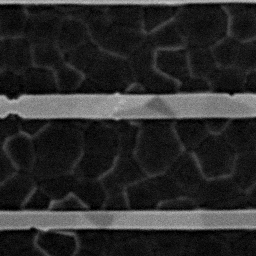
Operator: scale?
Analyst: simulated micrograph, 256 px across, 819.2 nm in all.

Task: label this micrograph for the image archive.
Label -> one or a few lines or trenches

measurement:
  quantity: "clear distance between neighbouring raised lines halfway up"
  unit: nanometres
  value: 296